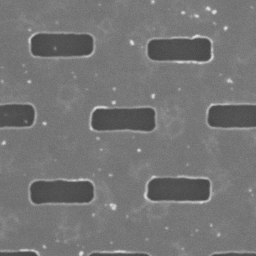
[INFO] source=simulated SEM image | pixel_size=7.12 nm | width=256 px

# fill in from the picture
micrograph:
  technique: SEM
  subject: holes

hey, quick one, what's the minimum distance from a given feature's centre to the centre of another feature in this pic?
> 638 nm